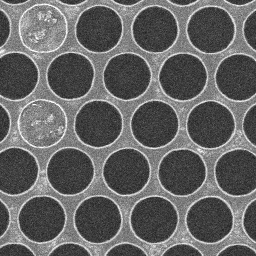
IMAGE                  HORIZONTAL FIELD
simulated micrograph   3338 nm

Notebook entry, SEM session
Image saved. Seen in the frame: a regular array of holes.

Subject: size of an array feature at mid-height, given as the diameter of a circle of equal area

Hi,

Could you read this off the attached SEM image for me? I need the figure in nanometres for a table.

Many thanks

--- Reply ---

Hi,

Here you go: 616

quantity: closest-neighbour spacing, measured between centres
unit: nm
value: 719